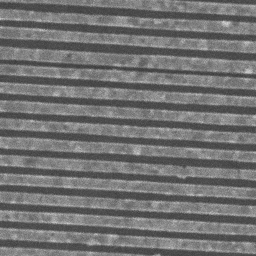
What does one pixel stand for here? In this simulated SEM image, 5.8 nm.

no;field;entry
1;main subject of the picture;parallel lines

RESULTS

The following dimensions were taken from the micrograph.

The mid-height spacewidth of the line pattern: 51.4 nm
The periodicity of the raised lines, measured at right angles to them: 0.106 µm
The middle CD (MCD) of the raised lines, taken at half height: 56.4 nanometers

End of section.